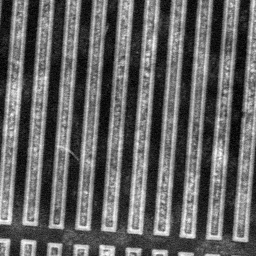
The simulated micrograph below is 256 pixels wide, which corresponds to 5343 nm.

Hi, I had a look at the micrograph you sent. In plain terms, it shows parallel lines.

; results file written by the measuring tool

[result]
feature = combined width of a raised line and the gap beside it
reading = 0.549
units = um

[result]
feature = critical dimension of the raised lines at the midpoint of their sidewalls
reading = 239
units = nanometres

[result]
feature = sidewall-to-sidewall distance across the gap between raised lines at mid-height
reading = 15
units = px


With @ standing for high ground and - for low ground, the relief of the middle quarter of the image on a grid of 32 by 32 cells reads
@@----@@@----@@@----@@----@@@---
@@----@@@----@@-----@@----@@@---
@@----@@@----@@-----@@----@@@---
@@----@@@----@@----@@@----@@@---
@@----@@@----@@----@@@----@@----
@@----@@@----@@----@@@----@@----
@@----@@@----@@----@@@----@@----
@@----@@@----@@----@@@----@@----
@@----@@----@@@----@@@----@@----
@@----@@----@@@----@@----@@@----
@@----@@----@@@----@@----@@@----
@@----@@----@@@----@@----@@@----
@@----@@----@@@----@@----@@@----
@----@@@----@@@----@@----@@@----
@----@@@----@@-----@@----@@@----
@----@@@----@@-----@@----@@@----
@----@@@----@@----@@@----@@@----
@----@@@----@@----@@@----@@@---@
@----@@@----@@----@@@----@@----@
@----@@@----@@----@@@----@@----@
@----@@@----@@----@@@----@@----@
@----@@@---@@@----@@@----@@----@
@----@@----@@@----@@----@@@----@
@----@@----@@@----@@----@@@----@
@----@@----@@@----@@----@@@----@
@----@@----@@@----@@----@@@----@
----@@@----@@@----@@----@@@----@
----@@@----@@-----@@----@@@----@
----@@@----@@-----@@----@@@----@
----@@@----@@----@@@----@@@----@
----@@@----@@----@@@----@@@---@@
----@@@----@@----@@@----@@----@@